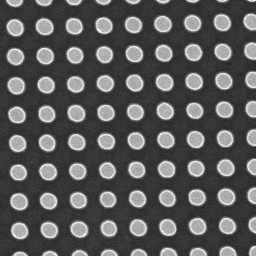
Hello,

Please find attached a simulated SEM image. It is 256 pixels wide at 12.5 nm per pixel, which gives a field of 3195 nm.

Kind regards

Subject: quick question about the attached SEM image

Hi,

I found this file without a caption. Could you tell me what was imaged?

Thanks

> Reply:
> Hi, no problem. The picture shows a regular array of raised bodies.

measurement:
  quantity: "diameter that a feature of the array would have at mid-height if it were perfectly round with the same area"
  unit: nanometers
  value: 213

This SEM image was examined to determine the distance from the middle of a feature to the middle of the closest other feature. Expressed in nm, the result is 361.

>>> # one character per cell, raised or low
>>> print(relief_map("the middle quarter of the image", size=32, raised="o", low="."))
................................
................................
...............................o
..oo.....ooo....ooo....oooo....o
.oooo...ooooo...oooo...oooo...oo
.oooo...oooo....oooo...oooo....o
.ooo.....ooo.....oo......o......
................................
................................
................................
..oo.....ooo....ooo.....ooo....o
.oooo...oooo....oooo...oooo....o
.oooo...oooo....oooo...oooo....o
.oooo....ooo.....oo.....ooo.....
................................
................................
................................
.........oo......oo.....ooo....o
.oooo....ooo....oooo....oooo...o
.oooo....oooo...oooo....oooo...o
.oooo....ooo.....ooo....ooo.....
................................
................................
................................
.........................o......
..ooo....ooo....oooo....oooo...o
.ooooo...oooo...oooo...ooooo...o
.ooooo...oooo...oooo....oooo....
..ooo.....oo....................
................................
................................
................................